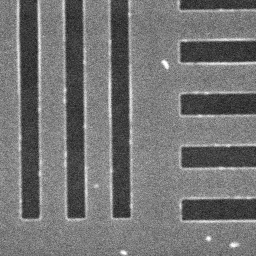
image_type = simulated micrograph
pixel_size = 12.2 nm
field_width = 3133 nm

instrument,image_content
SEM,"groups of lines, slits or small figures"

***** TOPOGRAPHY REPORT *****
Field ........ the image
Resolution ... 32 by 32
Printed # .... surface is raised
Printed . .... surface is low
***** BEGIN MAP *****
##...###...###..######..........
##...###...###..################
##...###...###..################
##...###...###..################
##...###...###..################
##...###...###..#######.........
##...###...###..######..........
##...###...###..#######.........
##...###...###..################
##...###...###..################
##...###...###..################
##...###...###..################
##...###...###..######..........
##...###...###..######..........
##...###...###..#######......###
##...###...###..################
##...###...###..################
##...###...###..################
##...###...###..#######.........
##...###...###..######..........
##...###...###..#######.........
###..###...###..################
###..###...###..################
###..###...###..################
###..###...###..################
###..###...###..#######.........
###..###...###..#######.........
###.###################.........
################################
################################
################################
################################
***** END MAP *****